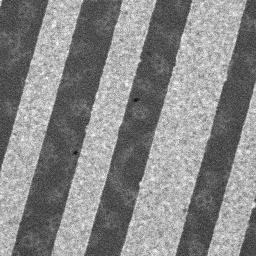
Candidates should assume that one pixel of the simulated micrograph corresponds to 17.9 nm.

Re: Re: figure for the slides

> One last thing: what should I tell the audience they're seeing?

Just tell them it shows one or a few lines or trenches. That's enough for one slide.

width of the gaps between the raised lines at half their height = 36.3 pixels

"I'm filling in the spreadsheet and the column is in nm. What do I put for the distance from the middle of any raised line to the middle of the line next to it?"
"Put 1330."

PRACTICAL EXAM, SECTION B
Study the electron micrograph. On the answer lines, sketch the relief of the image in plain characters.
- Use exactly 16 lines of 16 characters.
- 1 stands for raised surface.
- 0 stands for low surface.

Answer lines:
0001100011001110
0001100110001110
0011000110011110
0011000110011100
0011001100011100
0011001100011100
0110001100111100
0110001100111001
0110011000111001
1100011001111001
1100011001110001
1100010001110011
1100110001110011
1000110011110011
1000110011100110
1001100011100110